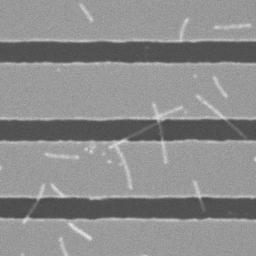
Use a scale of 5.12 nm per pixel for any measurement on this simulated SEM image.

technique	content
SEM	lines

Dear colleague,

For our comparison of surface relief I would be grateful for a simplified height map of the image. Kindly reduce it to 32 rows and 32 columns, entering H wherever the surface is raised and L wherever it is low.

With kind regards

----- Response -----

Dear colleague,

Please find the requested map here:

HHHHHHHHHHHHHHHHHHHHHHHHHHHHHHHH
HHHHHHHHHHHHHHHHHHHHHHHHHHHHHHHH
HHHHHHHHHHHHHHHHHHHHHHHHHHHHHHHH
HHHHHHHHHHHHHHHHHHHHHHHHHHHHHHHH
HHHHHHHHHHHHHHHHHHHHHHHHHHHHHHHH
LLLLLLLLLLLLLLLLLLLLLLLLLLLLLLLL
LLLLLLLLLLLLLLLLLLLLLLLLLLLLLLLL
LLLLLLLLLLLLLLLLLLLLLLLLLLLLLLLL
HHHHHHHHHHHHHHHHHHHHHHHHHHHHHHHH
HHHHHHHHHHHHHHHHHHHHHHHHHHHHHHHH
HHHHHHHHHHHHHHHHHHHHHHHHHHHHHHHH
HHHHHHHHHHHHHHHHHHHHHHHHHHHHHHHH
HHHHHHHHHHHHHHHHHHHHHHHHHHHHHHHH
HHHHHHHHHHHHHHHHHHHHHHHHHHHHHHHH
HHHHHHHHHHHHHHHHHHHHHHHHHHHHHHHH
LLLLLLLLLLLLLLLLLLLLLLLLLLLLLLLL
LLLLLLLLLLLLLLLLLLLLLLLLLLLLLLLL
LLLLLLLLLLLLLLLHLLLLLLLLLLLLLLLL
HHHHHHHHHHHHHHHHHHHHHHHHHHHHHHHH
HHHHHHHHHHHHHHHHHHHHHHHHHHHHHHHH
HHHHHHHHHHHHHHHHHHHHHHHHHHHHHHHH
HHHHHHHHHHHHHHHHHHHHHHHHHHHHHHHH
HHHHHHHHHHHHHHHHHHHHHHHHHHHHHHHH
HHHHHHHHHHHHHHHHHHHHHHHHHHHHHHHH
HHHHHHHHHHHHHHHHHHHHHHHHHHHHHHHH
LLLLLLLLLLLLLLLLLLLLLLLLLLLLLLLL
LLLLLLLLLLLLLLLLLLLLLLLLLLLLLLLL
HHHHHHHHHHHLHHHHHHHHHHHHHHHHHHHL
HHHHHHHHHHHHHHHHHHHHHHHHHHHHHHHH
HHHHHHHHHHHHHHHHHHHHHHHHHHHHHHHH
HHHHHHHHHHHHHHHHHHHHHHHHHHHHHHHH
HHHHHHHHHHHHHHHHHHHHHHHHHHHHHHHH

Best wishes